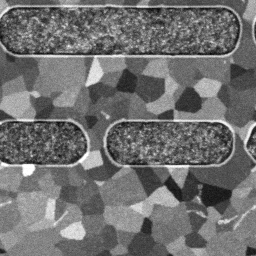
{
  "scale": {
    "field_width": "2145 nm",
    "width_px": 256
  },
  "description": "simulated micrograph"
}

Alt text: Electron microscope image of one or a few lines or trenches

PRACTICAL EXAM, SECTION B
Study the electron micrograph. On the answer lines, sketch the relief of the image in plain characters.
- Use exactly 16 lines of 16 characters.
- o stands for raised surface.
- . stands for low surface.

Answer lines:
o.............oo
...............o
...............o
ooooo..oo.....oo
oooooooooooooooo
oooooooooooooooo
oooooooooooooooo
oooooooooooooooo
.....oo........o
.....oo.......oo
oooooooooooooooo
oooooooooooooooo
oooooooooooooooo
oooooooooooooooo
oooooooooooooooo
oooooooooooooooo